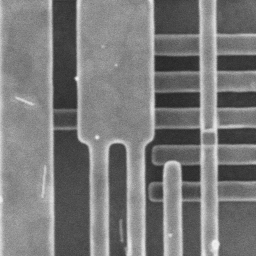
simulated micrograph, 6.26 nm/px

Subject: wiring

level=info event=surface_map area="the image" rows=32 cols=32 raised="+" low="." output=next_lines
++++++....+++++++++......++.....
++++++....+++++++++......++.....
++++++....+++++++++......++.....
++++++....+++++++++......++.....
++++++....+++++++++......++.....
++++++....+++++++++......++.....
+++++++...+++++++++......++.....
+++++++...+++++++++......++.....
++++++....+++++++++......++.....
++++++....+++++++++......++.....
+++++++...+++++++++......++.....
+++++++...+++++++++......++.....
+++++++...+++++++++......++.....
+++++++...+++++++++......++.....
+++++++...+++++++++......++.....
+++++++...+++++++++......++.....
+++++++...+++++++++......++.....
+++++++...+++++++++......++.....
+++++++....+++..++.......++.....
+++++++....++...++.......++.....
+++++++....++...++...+...++.....
+++++++....++...++..+++..++.....
+++++++....++...++..+++..++.....
+++++++....++...++..+++..++.....
+++++++....++...++...++..++.....
+++++++....++...++...++..++.....
+++++++....++...++...++..++.....
+++++++....++...++...++..++.....
+++++++....++...++...++..++.....
+++++++....++...++...++..++.....
+++++++....++...++...++..++.....
+++++++....+++..++...++..++.....